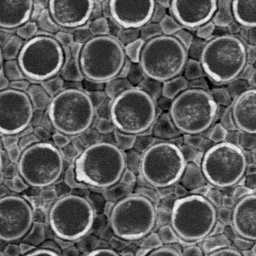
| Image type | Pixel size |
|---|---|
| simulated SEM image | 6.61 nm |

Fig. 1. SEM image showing a regular array of raised bodies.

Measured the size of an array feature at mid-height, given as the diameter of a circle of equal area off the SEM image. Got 280 nanometres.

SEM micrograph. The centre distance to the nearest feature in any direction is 400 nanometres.